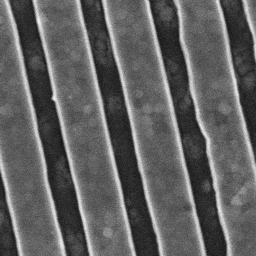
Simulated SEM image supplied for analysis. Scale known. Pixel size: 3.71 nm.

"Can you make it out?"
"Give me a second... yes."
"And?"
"one or a few lines or trenches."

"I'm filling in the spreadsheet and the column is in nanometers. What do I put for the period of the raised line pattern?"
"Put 254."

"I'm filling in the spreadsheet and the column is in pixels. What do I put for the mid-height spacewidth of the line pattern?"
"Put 24.7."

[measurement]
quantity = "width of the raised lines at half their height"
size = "0.162 µm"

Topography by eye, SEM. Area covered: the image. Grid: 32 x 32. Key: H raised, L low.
HLLLHHHHHHLLLHHHHHHLLLHHHHHLLLLH
HLLLHHHHHHLLLHHHHHHLLLHHHHHHLLLH
HHLLLHHHHHLLLHHHHHHLLLHHHHHHLLLH
HHLLLHHHHHHLLLHHHHHLLLLHHHHHLLLH
HHLLLHHHHHHLLLHHHHHLLLLHHHHHLLLL
HHLLLHHHHHHLLLHHHHHHLLLHHHHHHLLL
HHHLLLHHHHHLLLHHHHHHLLLHHHHHHLLL
HHHLLLHHHHHLLLLHHHHHLLLHHHHHHLLL
HHHLLLHHHHHHLLLHHHHHLLLLHHHHHLLL
HHHLLLHHHHHHLLLHHHHHHLLLHHHHHLLL
HHHLLLHHHHHHLLLHHHHHHLLLHHHHHLLL
HHHHLLLHHHHHLLLLHHHHHLLLHHHHHHLL
HHHHLLLHHHHHHLLLHHHHHLLLHHHHHHLL
HHHHLLLHHHHHHLLLHHHHHHLLHHHHHHLL
HHHHLLLHHHHHHLLLHHHHHHLLLHHHHHLL
HHHHHLLLHHHHHLLLHHHHHHLLLHHHHHHL
HHHHHLLLHHHHHLLLLHHHHHLLLHHHHHHL
HHHHHLLLHHHHHHLLLHHHHHLLLLHHHHHL
HHHHHLLLHHHHHHLLLHHHHHHLLLHHHHHL
HHHHHLLLHHHHHHLLLHHHHHHLLLHHHHHH
HHHHHHLLLHHHHHLLLHHHHHHLLLHHHHHH
HHHHHHLLLHHHHHHLLLHHHHHLLLHHHHHH
HHHHHHLLLHHHHHHLLLHHHHHHLLLHHHHH
LHHHHHLLLHHHHHHLLLHHHHHHLLLHHHHH
LHHHHHLLLLHHHHHLLLHHHHHHLLLHHHHH
LHHHHHHLLLHHHHHLLLLHHHHHLLLHHHHH
LHHHHHHLLLHHHHHHLLLHHHHHLLLHHHHH
LLHHHHHLLLHHHHHHLLLHHHHHHLLLHHHH
LLHHHHHLLLLHHHHHLLLHHHHHHLLLHHHH
LLHHHHHHLLLHHHHHLLLLHHHHHLLLHHHH
LLHHHHHHLLLHHHHHLLLLHHHHHLLLHHHH
LLHHHHHHLLLHHHHHHLLLHHHHHHLLHHHH